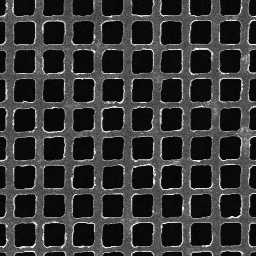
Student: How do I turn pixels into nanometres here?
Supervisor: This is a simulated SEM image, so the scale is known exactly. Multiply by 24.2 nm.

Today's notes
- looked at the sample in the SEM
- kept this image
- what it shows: a regular array of holes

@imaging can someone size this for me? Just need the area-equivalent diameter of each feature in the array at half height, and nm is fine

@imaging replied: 589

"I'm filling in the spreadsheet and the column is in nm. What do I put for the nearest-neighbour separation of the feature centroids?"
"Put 695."